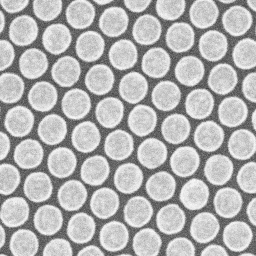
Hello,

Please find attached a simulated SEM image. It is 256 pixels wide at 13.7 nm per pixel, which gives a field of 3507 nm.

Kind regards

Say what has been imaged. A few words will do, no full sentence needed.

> a regular array of raised bodies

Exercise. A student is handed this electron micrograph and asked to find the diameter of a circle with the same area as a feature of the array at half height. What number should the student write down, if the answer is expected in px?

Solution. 27.5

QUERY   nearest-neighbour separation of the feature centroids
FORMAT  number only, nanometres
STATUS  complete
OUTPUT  464